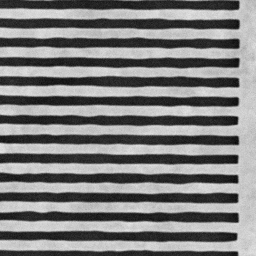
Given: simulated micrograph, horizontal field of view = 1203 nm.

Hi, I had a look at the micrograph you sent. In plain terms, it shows groups of lines, slits or small figures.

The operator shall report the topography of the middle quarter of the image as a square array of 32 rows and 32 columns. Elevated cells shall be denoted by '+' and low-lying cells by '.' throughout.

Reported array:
................................
++++++++++++++++++++++++++++++++
++++++++++++++++++++++++++++++++
................................
................................
+...............................
++++++++++++++++++++++++++++++++
++++++++++++++++++++++++++++++++
................................
................................
....+++++++++................++.
++++++++++++++++++++++++++++++++
++++++++++++++++++++++++++++++++
................................
................................
++++++++++++++++++..++++++++++++
++++++++++++++++++++++++++++++++
++.+++++++..++..++++++++++++++++
................................
................................
++++++++++++++++++++++++++.+++++
++++++++++++++++++++++++++++++++
..............................++
................................
................................
++++++++++++++++++++++++++++++++
++++++++++++++++++++++++++++++++
....................+++.......++
................................
................................
++++++++++++++++++++++++++++++++
++++++++++++++++++++++++++++++++